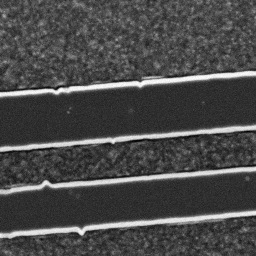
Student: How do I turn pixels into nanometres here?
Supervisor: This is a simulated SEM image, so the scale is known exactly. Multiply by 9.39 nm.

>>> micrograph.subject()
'one or a few lines or trenches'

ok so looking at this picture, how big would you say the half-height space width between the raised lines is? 0.379 micrometres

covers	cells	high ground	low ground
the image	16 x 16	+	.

................
................
................
................
................
.....+++++++++++
++++++++++++++++
++++++++++++++++
++++++++++......
................
................
....++++++++++++
++++++++++++++++
++++++++++++++..
+++.............
................